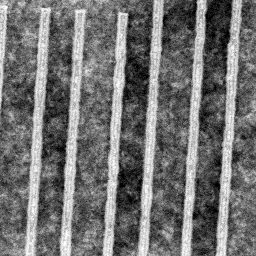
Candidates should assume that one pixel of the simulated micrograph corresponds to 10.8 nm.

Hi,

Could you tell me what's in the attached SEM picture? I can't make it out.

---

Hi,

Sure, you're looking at parallel lines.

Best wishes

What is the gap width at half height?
304 nanometers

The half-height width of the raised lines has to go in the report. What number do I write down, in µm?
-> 0.0818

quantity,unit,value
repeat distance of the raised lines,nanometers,410